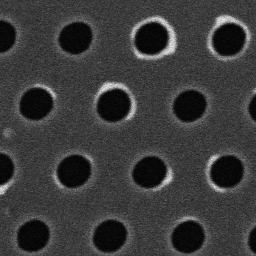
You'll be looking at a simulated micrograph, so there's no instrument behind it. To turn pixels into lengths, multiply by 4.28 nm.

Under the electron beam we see a regular array of holes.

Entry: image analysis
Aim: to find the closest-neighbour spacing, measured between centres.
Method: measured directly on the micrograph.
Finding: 323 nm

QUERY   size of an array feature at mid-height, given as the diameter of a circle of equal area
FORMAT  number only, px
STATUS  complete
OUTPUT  33.4